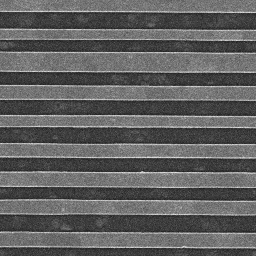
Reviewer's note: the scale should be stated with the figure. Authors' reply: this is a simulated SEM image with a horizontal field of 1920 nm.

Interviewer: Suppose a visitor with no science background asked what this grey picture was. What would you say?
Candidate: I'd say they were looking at parallel lines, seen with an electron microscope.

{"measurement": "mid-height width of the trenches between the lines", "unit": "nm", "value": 115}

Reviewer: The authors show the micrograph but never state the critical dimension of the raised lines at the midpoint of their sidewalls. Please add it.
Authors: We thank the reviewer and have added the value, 14.4 pixels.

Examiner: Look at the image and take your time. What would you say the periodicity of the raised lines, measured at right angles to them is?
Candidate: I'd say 220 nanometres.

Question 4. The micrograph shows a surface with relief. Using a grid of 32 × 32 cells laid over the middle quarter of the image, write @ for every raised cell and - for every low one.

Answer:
@@@@@@@@@@@@@@@@@@@@@@@@@@@@@@@@
@@@@@@@@@@@@@@@@@@@@@@@@@@@@@@@@
--------------------------------
--------------------------------
--------------------------------
--------------------------------
@@@@@@@@@@@@@@@@@@@@@@@@@@@@@@@@
@@@@@@@@@@@@@@@@@@@@@@@@@@@@@@@@
@@@@@@@@@@@@@@@@@@@@@@@@@@@@@@@@
--------------------------------
--------------------------------
--------------------------------
--------------------------------
@@@@@@@@@@@@@@@@@@@@@@@@@@@@@@@@
@@@@@@@@@@@@@@@@@@@@@@@@@@@@@@@@
@@@@@@@@@@@@@@@@@@@@@@@@@@@@@@@@
--------------------------------
--------------------------------
--------------------------------
--------------------------------
@@@@@@@@@@@@@@@@@@@@@@@@@@@@@@@@
@@@@@@@@@@@@@@@@@@@@@@@@@@@@@@@@
@@@@@@@@@@@@@@@@@@@@@@@@@@@@@@@@
--------------------------------
--------------------------------
--------------------------------
--------------------------------
@@@@@@@@@@@@@@@@@@@@@@@@@@@@@@@@
@@@@@@@@@@@@@@@@@@@@@@@@@@@@@@@@
@@@@@@@@@@@@@@@@@@@@@@@@@@@@@@@@
@@@@@@@@@@@@@@@@@@@@@@@@@@@@@@@@
--------------------------------